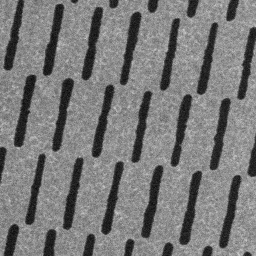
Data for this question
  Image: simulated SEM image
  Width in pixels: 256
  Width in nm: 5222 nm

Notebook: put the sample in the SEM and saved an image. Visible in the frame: a regular array of holes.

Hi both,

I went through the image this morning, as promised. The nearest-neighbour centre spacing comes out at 38.9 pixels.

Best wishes